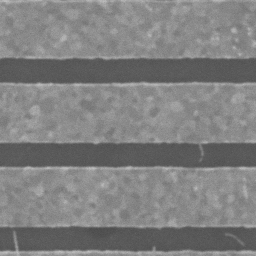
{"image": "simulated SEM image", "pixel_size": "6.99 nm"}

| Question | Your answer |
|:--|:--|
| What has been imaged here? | lines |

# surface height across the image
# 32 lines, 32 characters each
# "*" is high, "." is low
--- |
********************************
********************************
********************************
********************************
********************************
********************************
********************************
................................
................................
................................
**...............**...****.*....
********************************
********************************
********************************
********************************
********************************
********************************
********************************
................................
................................
................................
********************************
********************************
********************************
********************************
********************************
********************************
********************************
................................
................................
................................
****************.***.****.*.****